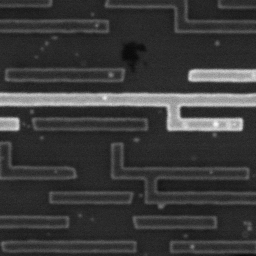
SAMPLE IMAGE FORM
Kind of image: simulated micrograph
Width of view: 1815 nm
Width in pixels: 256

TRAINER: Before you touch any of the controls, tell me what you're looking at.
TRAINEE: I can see wiring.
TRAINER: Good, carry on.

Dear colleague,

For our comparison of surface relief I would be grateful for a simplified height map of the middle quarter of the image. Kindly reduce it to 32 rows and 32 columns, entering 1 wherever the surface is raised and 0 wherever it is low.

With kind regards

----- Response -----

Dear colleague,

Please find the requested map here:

00000000000000000000000000000000
11111111111111100000000000000000
11111111111111100000000000000001
11111111111111100000000000000001
00000000000000000000000000000000
00000000000000000000000000000000
00000000000000000000000000000000
10111110111100111111100000000000
11111111111111111111111111111111
11111111111111111111111111111111
00000000000000000000000001111000
00000000000000000000000000111000
00000000000000000000000000111000
00000000000000000000000000111000
11111111111111111111100000111111
11111111111111111111100000111111
00000000000000000000000000000000
00000000000000000000000000000000
00000000000000000000000000000000
00000000000000000000000000000000
00000000000011100000000000000000
00000000000011100000000000000000
00000000000011100000000000000000
00000000000011100000000000000000
00000000000011100000000000000000
00000000000011100000000000000000
11100000000011111111111111111111
11100000000011111111111111111111
11100000000011111111111111111111
00000000000000000000111000000000
00000000000000000000111000000000
00000000000000000000111000000000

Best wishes